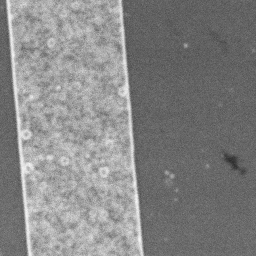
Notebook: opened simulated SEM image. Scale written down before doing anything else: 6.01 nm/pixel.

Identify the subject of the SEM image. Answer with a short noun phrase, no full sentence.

one or a few lines or trenches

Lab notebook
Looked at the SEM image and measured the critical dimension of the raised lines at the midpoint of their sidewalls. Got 675 nanometres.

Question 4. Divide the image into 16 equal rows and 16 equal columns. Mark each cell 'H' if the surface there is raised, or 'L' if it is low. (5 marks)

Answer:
LHHHHHHHLLLLLLLL
LHHHHHHHLLLLLLLL
LHHHHHHHLLLLLLLL
LHHHHHHHLLLLLLLL
LHHHHHHHLLLLLLLL
LHHHHHHHLLLLLLLL
LHHHHHHHLLLLLLLL
LHHHHHHHLLLLLLLL
LHHHHHHHLLLLLLLL
LHHHHHHHLLLLLLLL
LHHHHHHHLLLLLLLL
LHHHHHHHHLLLLLLL
LLHHHHHHHLLLLLLL
LLHHHHHHHLLLLLLL
LLHHHHHHHLLLLLLL
LLHHHHHHHLLLLLLL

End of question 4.